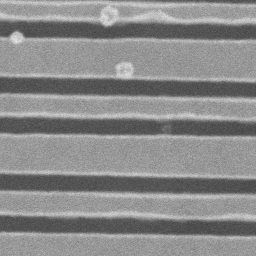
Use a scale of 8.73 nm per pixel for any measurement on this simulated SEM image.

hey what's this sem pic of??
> lines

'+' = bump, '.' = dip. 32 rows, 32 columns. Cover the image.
+++++++++++++++++++++++++++.....
++++++++++++++++++++++++++++++++
...+...+++++++++++++++++++++++++
................................
.++.............................
++++++++++++++++++++++++++++++++
++++++++++++++++++++++++++++++++
++++++++++++++++++++++++++++++++
++++++++++++++++++++++++++++++++
++++++++++++++++++++++++++++++++
................................
................................
++++++++++++++++++++++++++++++++
++++++++++++++++++++++++++++++++
..+..+++++++++++++++++++++++++++
................................
................................
++++++++++++++++++++++++++++++++
++++++++++++++++++++++++++++++++
++++++++++++++++++++++++++++++++
++++++++++++++++++++++++++++++++
++++++++++++++++++++++++++++++++
................................
................................
++++++++++++++++++++++++++++++++
++++++++++++++++++++++++++++++++
++++++++++++++++++++++++++++++++
...............................+
................................
+++++++++++++++++++++++++++.....
++++++++++++++++++++++++++++++++
++++++++++++++++++++++++++++++++